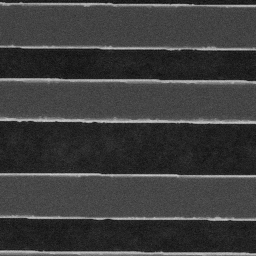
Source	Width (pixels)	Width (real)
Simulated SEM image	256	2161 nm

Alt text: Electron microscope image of lines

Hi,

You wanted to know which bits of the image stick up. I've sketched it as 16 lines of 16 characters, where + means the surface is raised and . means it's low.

++++++++++++++++
++++++++++++++++
++++++++++++++++
................
................
++++++++++++++++
++++++++++++++++
++++++++++++++++
................
................
................
++++++++++++++++
++++++++++++++++
++++++++++++++++
................
................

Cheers